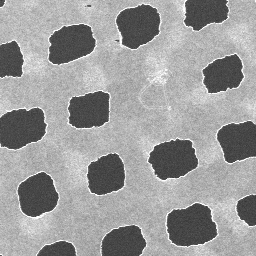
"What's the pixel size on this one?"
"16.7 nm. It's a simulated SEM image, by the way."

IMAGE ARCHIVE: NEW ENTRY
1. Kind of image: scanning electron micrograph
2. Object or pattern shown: a regular array of holes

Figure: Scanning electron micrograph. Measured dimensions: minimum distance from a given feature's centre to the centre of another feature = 1.15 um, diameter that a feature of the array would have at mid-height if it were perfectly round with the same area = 43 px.